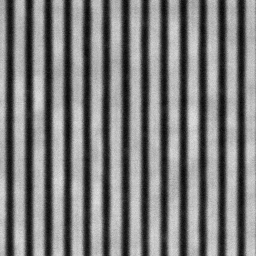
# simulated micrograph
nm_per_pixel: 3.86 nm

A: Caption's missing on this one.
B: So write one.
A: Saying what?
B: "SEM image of parallel lines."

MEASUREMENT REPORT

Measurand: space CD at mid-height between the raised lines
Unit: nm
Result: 38.1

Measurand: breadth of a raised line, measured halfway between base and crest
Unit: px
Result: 10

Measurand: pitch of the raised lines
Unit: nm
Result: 74.4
